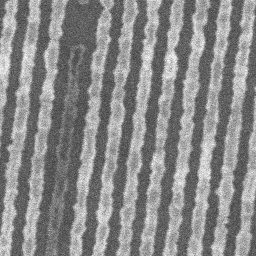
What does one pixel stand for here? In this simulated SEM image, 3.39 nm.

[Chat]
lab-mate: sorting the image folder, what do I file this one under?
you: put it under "parallel lines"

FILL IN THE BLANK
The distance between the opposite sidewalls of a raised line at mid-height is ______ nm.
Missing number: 33.6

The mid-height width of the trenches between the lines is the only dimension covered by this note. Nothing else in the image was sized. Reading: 45.8 nanometers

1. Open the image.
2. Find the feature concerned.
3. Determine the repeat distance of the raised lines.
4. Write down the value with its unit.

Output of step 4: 80.2 nanometres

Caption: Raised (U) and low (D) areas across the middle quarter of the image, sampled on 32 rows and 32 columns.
DDUUDDDUUUDDDUUUDDDDUDDDDUUUDDDU
DUUDDDDUUUDDDUUUDDDUUUDDDUUUDDDU
DUUDDDDUUUDDDUUUDDDUUUDDDUUUDDDU
DDUDDDDUUDDDDUUDDDDUUUDDDUUUDDDU
DDUDDDDUUDDDDUUDDDDUUUDDDUUDDDUU
DUUDDDDUUDDDDUUDDDDUUDDDDUUDDDUU
DUUDDDUUUDDDDUUDDDDUUDDDDUUDDDUU
DUUDDDUUUDDDUUUDDDDUUDDDDUUDDDUU
UUUDDDDUUDDDUUUDDDUUUDDDUUUDDDUU
UUUDDDUUUDDDUUDDDDUUUDDDUUUDDDUU
UUUDDDDUUDDDUUUDDDUUUDDDUUDDDDUU
UUUDDDUUDDDDUUUDDDUUDDDDUUDDDDUU
UUUDDDUUDDDDUUUDDDUUDDDDUUDDDDUU
UUUDDDUUDDDDUUUDDUUUDDDDUUDDDDUU
UUDDDDUUUDDDUUDDDUUUDDDUUUDDDUUU
UUDDDDUUDDDUUUDDDDUUDDDDUUDDDDUU
UUDDDUUUDDDUUUDDDDUUDDDUUDDDDDUU
UUDDDUUUDDDUUUDDDUUUDDDUUDDDDUUU
UUDDDUUDDDDUUUDDDDUUDDDUUDDDDUUU
UUDDDUUUDDDUUUDDDUUUDDDUUDDDDUUD
UUDDDUUDDDDUUDDDDUUDDDDUUDDDDUUU
UDDDDUUUDDDUUDDDDUUDDDDUUDDDDUUU
UDDDDUUUDDDUUDDDDUUDDDDUUDDDDUUD
UDDDUUUDDDDUUDDDUUUDDDDUUDDDUUUD
UDDDDUUDDDDUUDDDUUUDDDUUUDDDUUUD
UDDDUUUDDDUUUDDDUUUDDDUUUDDDUUUD
UDDDUUUDDDUUUDDDUUUDDDUUUDDDUUUD
UDDDUUUDDDUUDDDDUUDDDDUUUDDDUUDD
UDDDUUDDDDUUDDDDUUDDDDUUDDDDUUDD
UDDDUUDDDDUUDDDDUUDDDDUUDDDDUUDD
DDDDUUDDDDUUDDDDUUDDDDUUDDDDUUDD
DDDDUUDDDDUUDDDDUUDDDUUUDDDUUUDD